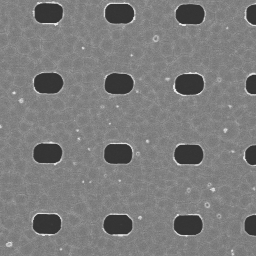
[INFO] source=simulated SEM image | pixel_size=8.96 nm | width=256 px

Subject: a regular array of holes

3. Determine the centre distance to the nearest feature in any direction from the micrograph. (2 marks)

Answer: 629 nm